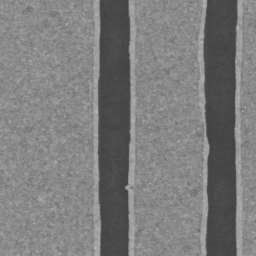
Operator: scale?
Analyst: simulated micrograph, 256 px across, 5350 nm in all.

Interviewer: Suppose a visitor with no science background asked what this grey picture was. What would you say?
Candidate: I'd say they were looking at one or a few lines or trenches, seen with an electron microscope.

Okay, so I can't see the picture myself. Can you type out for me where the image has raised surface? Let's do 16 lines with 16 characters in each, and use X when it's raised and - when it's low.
XXXXXX--XXXXX--X
XXXXXX--XXXXX--X
XXXXXX--XXXXX--X
XXXXXX--XXXXX--X
XXXXXX--XXXXX--X
XXXXXX--XXXXX--X
XXXXXX--XXXXX--X
XXXXXX--XXXXX--X
XXXXXX--XXXXX--X
XXXXXX--XXXXX--X
XXXXXX--XXXXX--X
XXXXXX--XXXXX--X
XXXXXX--XXXXX--X
XXXXXX--XXXXX--X
XXXXXX--XXXXX--X
XXXXXX--XXXXX--X